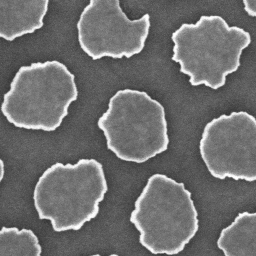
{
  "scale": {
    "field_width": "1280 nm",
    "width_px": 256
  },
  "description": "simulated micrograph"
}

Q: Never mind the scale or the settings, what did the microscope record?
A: raised bodies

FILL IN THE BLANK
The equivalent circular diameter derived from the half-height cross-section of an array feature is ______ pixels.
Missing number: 68.2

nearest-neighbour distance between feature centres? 474 nm